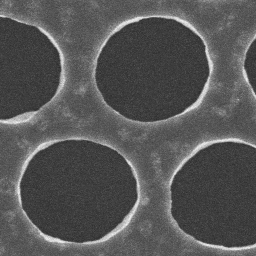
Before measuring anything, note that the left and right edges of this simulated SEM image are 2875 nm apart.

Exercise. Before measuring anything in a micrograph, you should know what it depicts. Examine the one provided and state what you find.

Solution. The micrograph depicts holes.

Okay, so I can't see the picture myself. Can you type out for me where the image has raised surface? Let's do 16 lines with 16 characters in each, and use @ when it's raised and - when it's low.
@@@@@@@@@@@@@@@@
--@@@@@@---@@@@@
---@@@@------@@@
----@@-------@@-
----@@-------@@-
----@@-------@@@
---@@@@-----@@@@
-@@@@@@@--@@@@@@
@@@@@@@@@@@@@@@@
@@-----@@@@@----
@@------@@@-----
@--------@@-----
@--------@@-----
@@------@@@-----
@@@----@@@@@----
@@@@@@@@@@@@@@@@